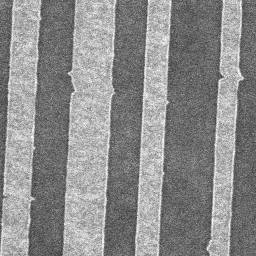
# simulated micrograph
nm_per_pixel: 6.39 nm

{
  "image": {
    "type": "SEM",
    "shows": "one or a few lines or trenches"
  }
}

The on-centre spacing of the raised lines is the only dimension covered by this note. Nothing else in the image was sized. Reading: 0.437 um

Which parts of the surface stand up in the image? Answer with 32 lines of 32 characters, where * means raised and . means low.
..***.....****.....**.......**..
..***....*****.....**.......**..
..***....*****.....**.......**..
..***....*****....***.......**..
..***....*****....***.......**..
..***....*****....***.......**..
.****....*****....***.......**..
.****....*****....***.......**..
.****....*****....***.......**..
.***.....*****....***.......**..
.***.....*****....***......***..
.***.....*****....***......***..
.***.....*****....***......***..
.***.....*****....***......***..
.***.....*****....***......**...
.***.....*****....***......**...
.***.....*****....**.......**...
.***.....*****....**.......**...
.***.....****.....**.......**...
.***.....****.....**.......**...
.***....*****.....**.......**...
.***....*****.....**.......**...
.***....*****.....**.......**...
.***....*****....***.......**...
.***....*****....***.......**...
****....*****....***.......**...
****....*****....***.......**...
****....*****....***.......**...
***.....*****....***.......**...
***.....*****....***......***...
****....*****....***......***...
***.....*****....***......***...